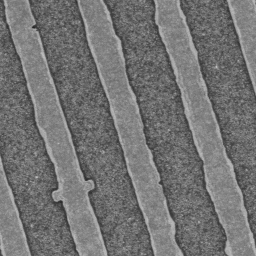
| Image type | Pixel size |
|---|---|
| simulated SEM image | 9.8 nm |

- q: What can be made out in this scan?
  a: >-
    one or a few lines or trenches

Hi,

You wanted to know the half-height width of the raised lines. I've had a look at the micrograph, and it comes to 244 nm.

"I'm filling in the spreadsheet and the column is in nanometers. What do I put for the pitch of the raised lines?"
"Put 707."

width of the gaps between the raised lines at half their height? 462 nm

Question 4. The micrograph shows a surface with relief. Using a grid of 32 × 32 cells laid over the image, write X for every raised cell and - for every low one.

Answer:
-XXX------XXX------XXX-------XXX
-XXX------XXX-------XXX------XXX
-XXX-------XXX------XXX------XXX
-XXX-------XXX------XXX-------XX
--XXX------XXXX-----XXXX------XX
--XXX------XXXX------XXX------XX
--XXX-------XXX------XXX------XX
---XXX------XXX------XXXX------X
---XXX------XXXX------XXX------X
---XXX-------XXX------XXX------X
----XXX------XXX------XXX-------
----XXX------XXX-------XXX------
----XXX-------XXX------XXX------
----XXXX------XXX------XXX------
-----XXX------XXX------XXXX-----
-----XXX------XXXX------XXX-----
-----XXXX------XXX------XXX-----
------XXX------XXX------XXXX----
------XXX------XXX-------XXX----
------XXX-------XXX------XXX----
-------XXX------XXX-------XXX---
-------XXX------XXXX------XXX---
X------XXXX------XXX------XXX---
X------XXXX------XXX------XXXX--
X------XXXX------XXXX-----XXXX--
XX------XXX-------XXX------XXX--
XX------XXXX------XXX------XXXX-
XX------XXXX------XXX-------XXX-
XXX------XXX-------XXX------XXX-
XXX------XXXX------XXX------XXX-
XXX------XXXX------XXX------XXXX
XXXX------XXX------XXXX------XXX